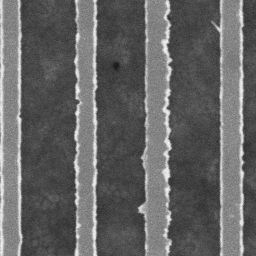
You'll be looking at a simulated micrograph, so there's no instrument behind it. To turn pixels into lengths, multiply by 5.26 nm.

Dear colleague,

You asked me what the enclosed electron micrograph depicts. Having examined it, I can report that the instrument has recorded one or a few lines or trenches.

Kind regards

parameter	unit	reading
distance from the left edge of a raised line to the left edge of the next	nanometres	386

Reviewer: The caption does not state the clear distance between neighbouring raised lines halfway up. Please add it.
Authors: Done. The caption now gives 281 nm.